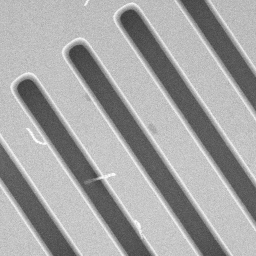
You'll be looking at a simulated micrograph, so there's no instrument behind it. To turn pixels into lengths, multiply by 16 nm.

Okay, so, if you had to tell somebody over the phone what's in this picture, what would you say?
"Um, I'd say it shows groups of lines, slits or small figures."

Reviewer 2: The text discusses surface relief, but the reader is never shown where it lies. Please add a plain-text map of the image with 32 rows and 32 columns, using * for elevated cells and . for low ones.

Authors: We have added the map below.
***********************...******
***************..******....*****
***************...******....****
***************....******...****
****************....*****....***
*********..******...******....**
********...******....******...**
*********...******....*****....*
*********....******...******....
**********....*****....******...
**...******...******....*****...
**...******....******...******..
**....******....*****....******.
***....******...******....*****.
****....*****....******...******
*****...******....*****....*****
*****....******...******....****
******....*****....******...****
.******...******....*****....***
..*****....******...******....**
..******....*****....******...**
...******...******....*****....*
....*****....******...******....
*...******....*****....******...
*....******...******....*****...
**....*****....******...******..
***...******....*****....******.
***....******...******....*****.
****....*****....******...******
*****...******....*****....*****
*****....******...******....****
******....*****....******...****